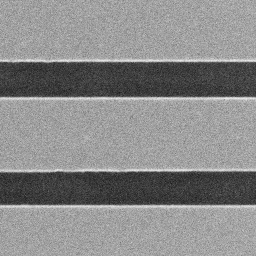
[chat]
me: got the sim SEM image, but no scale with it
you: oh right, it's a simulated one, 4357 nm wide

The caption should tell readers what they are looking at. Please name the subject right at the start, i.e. lines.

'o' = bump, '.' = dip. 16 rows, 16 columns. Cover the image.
oooooooooooooooo
oooooooooooooooo
oooooooooooooooo
oooooooooooooooo
................
................
oooooooooooooooo
oooooooooooooooo
oooooooooooooooo
oooooooooooooooo
oooooooooooooooo
................
................
oooooooooooooooo
oooooooooooooooo
oooooooooooooooo